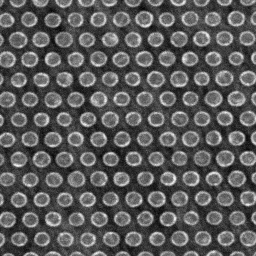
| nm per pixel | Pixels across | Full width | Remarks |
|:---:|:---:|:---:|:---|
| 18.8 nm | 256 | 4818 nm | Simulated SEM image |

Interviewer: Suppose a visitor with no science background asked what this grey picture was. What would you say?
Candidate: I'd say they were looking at a regular array of raised bodies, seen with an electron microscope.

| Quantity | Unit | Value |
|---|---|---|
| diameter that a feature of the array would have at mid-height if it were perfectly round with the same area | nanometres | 272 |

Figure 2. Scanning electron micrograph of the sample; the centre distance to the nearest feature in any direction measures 423 nm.